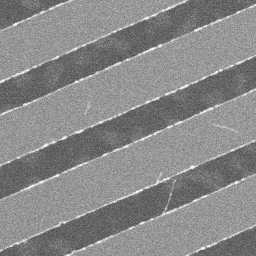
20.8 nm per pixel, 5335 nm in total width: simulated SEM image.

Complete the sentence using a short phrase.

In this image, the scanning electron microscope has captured one or a few lines or trenches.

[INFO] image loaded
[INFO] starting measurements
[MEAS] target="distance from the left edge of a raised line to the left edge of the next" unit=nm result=1620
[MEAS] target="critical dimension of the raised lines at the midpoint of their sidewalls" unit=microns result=0.663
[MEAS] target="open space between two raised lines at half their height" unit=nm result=957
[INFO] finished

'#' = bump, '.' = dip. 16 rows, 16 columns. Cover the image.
###........#####
#.......#####...
......#####.....
....#####.......
..####........##
####.......#####
##.......#####..
.......#####....
....#####.......
..#####.......##
#####.......####
##........#####.
.......#####....
.....#####......
...#####.......#
#####........###